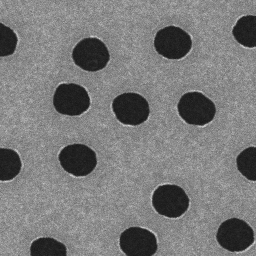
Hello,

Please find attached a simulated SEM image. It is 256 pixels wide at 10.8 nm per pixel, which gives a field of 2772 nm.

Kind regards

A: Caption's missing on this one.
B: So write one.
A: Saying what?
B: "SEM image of a regular array of holes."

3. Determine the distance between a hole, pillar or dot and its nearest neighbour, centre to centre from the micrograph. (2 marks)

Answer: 0.681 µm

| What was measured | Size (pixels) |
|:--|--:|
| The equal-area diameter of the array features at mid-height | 35.5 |